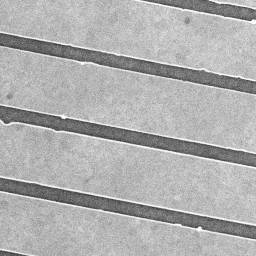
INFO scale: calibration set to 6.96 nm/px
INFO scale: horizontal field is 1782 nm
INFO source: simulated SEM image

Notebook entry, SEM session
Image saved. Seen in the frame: one or a few lines or trenches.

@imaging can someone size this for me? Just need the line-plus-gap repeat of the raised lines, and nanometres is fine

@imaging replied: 496